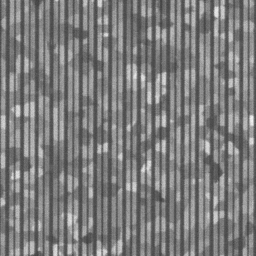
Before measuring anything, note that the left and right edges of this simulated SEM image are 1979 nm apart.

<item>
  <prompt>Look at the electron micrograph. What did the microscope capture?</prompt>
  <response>parallel lines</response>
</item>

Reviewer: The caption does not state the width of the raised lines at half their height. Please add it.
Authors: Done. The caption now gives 20.3 nm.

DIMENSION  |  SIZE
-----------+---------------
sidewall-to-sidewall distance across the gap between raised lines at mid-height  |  27.1 nm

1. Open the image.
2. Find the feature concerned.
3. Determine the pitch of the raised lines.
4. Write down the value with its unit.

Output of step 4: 56.5 nm